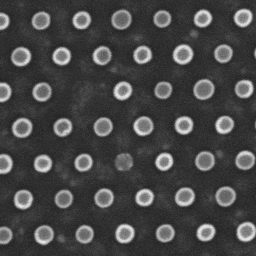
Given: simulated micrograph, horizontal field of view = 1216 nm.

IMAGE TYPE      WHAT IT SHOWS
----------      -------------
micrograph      a regular array of raised bodies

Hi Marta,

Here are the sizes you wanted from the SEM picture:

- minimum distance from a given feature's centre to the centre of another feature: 192 nm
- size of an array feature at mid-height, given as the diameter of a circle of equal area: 0.0803 µm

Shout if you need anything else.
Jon